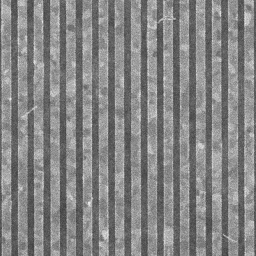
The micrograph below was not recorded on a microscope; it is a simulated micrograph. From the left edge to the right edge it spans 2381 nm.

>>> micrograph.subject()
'parallel lines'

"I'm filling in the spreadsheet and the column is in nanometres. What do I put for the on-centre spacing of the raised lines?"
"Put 151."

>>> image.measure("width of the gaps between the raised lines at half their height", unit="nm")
69.7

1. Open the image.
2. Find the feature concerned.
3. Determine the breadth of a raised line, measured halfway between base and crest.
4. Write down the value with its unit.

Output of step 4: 83.7 nm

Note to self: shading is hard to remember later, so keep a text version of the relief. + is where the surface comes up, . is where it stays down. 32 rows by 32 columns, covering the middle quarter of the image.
.++..++..++..++..++..++..++..++.
.++..+++.++..++..++..++..++..++.
.++..++..++..++..++..++..++..++.
.++..++..++..++..++..++..++..++.
.++..++..++..++..++..++..++..++.
.++..++..++..++..++..++..++..++.
.++..++..++..++..++..++..++..++.
.++..++..++..++..++..++..++..++.
.++..++..++..++..++..++..++..++.
.++..++..++..++..++..++..++..++.
.++..++..++..++..++..++..++..++.
.++..++..++..++..++..++..++..++.
.++..++..++..++..++..++..++..++.
.++..++..++..++..++..++..++..++.
.++..++..++..++..++..++..++..++.
.++..++..++..++..++..++..++..++.
.++..++..++..++..++..++..++..++.
.++..++..++..++..++..++..++..++.
.++..++..++..++..++..++..++..++.
.++..++..++..++..++..++..++..++.
.++..++..++..++..++..++..++..++.
.++..++..++..++..++..++..++..++.
.++..++..++..++..++..++..++..++.
.++..++..++..++..++..++..++..++.
.++..++..++..++..++..++..++..++.
.++..++..++..++..++..++..++..++.
.++..++..++..++..++..++..++..++.
.++..++..++..++..++..++..++..++.
.++..++..++..++..++..++..++..++.
.++..++..++..++..++..++..++..++.
.++..++..++..++..++..++..++..++.
.++..++..++..++..++..++..++..++.